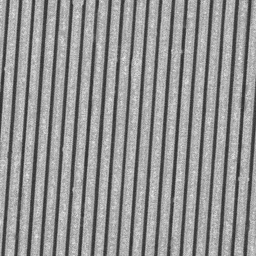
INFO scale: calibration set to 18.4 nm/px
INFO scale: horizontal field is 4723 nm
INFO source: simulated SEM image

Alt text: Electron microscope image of parallel lines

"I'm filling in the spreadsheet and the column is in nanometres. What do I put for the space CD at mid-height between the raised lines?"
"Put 80.5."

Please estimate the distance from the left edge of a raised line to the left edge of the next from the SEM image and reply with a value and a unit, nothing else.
234 nanometers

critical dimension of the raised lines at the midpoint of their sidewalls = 161 nanometres